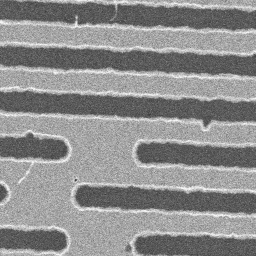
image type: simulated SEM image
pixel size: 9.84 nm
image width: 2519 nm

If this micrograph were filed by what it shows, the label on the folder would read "parallel lines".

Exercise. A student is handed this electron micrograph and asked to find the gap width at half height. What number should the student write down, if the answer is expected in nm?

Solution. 224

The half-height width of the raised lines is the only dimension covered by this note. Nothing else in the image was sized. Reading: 22.7 pixels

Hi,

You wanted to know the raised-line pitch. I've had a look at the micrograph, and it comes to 450 nm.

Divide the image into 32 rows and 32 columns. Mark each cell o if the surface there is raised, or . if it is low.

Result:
..............o...oooooooooooooo
................................
................................
oooooooooooooooooo.o.o..........
oooooooooooooooooooooooooooooooo
oooooooooooooooooooooooooooooooo
......................o..ooooooo
................................
o.o.............................
oooooooooooooooooooooooooo...o..
oooooooooooooooooooooooooooooooo
......oooooooooooooooooooooooooo
.............................ooo
................................
oooooooo.o......................
ooooooooooooooooooooooooo.oooooo
oooooooooooooooooooooooooooooooo
........oooooooooooooooooooooooo
.........oooooooo...............
........ooooooooo...............
oooooooooooooooooo..............
oooooooooooooooooooooooooooooooo
oooooooooooooooooooooooooooooooo
.ooooooooo.........ooooooooooooo
.oooooooo.......................
oooooooooo......................
ooooooooooooooooooooo.oo........
oooooooooooooooooooooooooooooooo
.ooooooooooooooooooooooooooooooo
........ooooooooo..........ooooo
.........oooooooo...............
oooo..o.ooooooooo...............